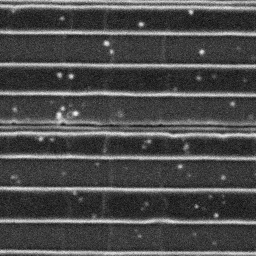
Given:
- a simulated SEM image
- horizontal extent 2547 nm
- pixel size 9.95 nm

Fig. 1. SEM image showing wiring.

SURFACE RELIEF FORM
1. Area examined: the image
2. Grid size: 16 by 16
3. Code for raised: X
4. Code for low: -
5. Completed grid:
XXXXXXXXXXXXXXX-
XXXXXXXXXXXXXXXX
----------------
----------------
XXXXXXXXXXXXXXXX
XXXXXXXXXXXXXXXX
----------------
----------------
XXXXXXXXXXXXXXXX
XXXXXXXXXXXXXXXX
----------------
----------------
XXXXXXXXXXXXXXXX
XXXXXXXXXXXXXXXX
----------------
----------------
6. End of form